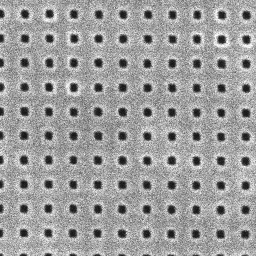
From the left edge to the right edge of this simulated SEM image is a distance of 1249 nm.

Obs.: a regular array of holes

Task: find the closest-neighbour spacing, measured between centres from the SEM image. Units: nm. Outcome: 118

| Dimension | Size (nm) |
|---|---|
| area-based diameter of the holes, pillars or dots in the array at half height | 44.8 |